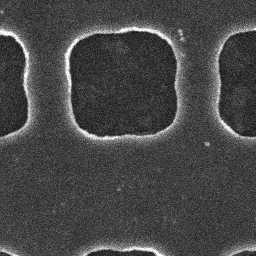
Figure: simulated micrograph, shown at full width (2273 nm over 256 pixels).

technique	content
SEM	holes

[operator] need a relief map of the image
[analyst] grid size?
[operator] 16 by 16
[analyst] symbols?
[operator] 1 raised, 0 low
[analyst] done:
1111111111111111
1111111111111111
0111100000111100
0011000000011100
0011000000011100
0011000000011100
0011000000011100
0011100000011100
1111110011111110
1111111111111111
1111111111111111
1111111111111111
1111111111111111
1111111111111111
1111111111111111
1111111111111111